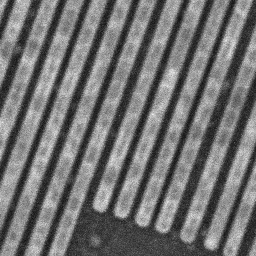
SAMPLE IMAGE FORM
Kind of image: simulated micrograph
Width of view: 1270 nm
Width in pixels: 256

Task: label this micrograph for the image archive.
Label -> parallel lines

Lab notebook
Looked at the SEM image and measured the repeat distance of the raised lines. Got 115 nm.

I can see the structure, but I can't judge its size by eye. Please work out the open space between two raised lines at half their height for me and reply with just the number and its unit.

53.1 nm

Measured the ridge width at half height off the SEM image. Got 58.4 nanometres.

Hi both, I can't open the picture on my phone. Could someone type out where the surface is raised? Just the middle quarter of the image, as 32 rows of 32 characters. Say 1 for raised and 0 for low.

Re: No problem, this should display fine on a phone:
01111001111000111000111000111000
01110001110001110000111001111000
11110001110001110001110001110001
11100011110001110001110001110001
11100011100011100001110011110001
11100011100011100011100011100011
11000111100111100011100011100011
11000111000111000011100111100111
11000111000111000111000111000111
10001110001110000111000111000111
10001110001110001111001110001110
10011110001110001110001110001110
00011100011100001110001110001110
00011100011100011100011100011100
00111100011100011100011100011100
00111000111000011100011100011100
00111000111000111100111000111000
01111001111000111000111000111001
01110001110000111001111001111001
01110001110001111001110001110001
11100011100001110001110001110011
11100011100011110011110011100011
11100011100011100011100011100111
11000111000011100111100011100111
11000111000111100111000111100111
11001111000111000111000111001111
10001110000111001111000111001111
10001110001110001110001111001110
10011110001110001110001110011110
00011100001110011110011110011110
00011100011100011100011100011100
00111000011100011100011100111100